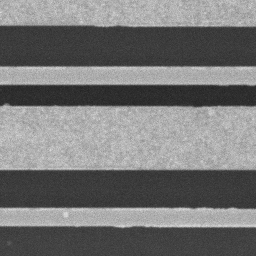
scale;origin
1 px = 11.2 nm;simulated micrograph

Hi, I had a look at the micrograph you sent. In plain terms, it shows lines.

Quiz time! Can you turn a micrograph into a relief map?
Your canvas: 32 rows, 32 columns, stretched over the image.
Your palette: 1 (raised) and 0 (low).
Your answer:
11111111111111111111111111111111
11111111111111111111111111111111
11111111111111111111111111111111
00000000000000000000000000000000
00000000000000000000000000000000
00000000000000000000000000000000
00000000000000000000000000000000
00000000000000000000000000000000
11111111111111111111111111111111
11111111111111111111111111111111
11111111111111111111111111111111
00000000000000000000000000000000
00000000000000000000000000000000
11111111111111111111111111111111
11111111111111111111111111111111
11111111111111111111111111111111
11111111111111111111111111111111
11111111111111111111111111111111
11111111111111111111111111111111
11111111111111111111111111111111
11111111111111111111111111111111
00000000000000000000000000000000
00000000000000000000000000000000
00000000000000000000000000000000
00000000000000000000000000000000
00000000000000000000000000000000
11111111111111111111111111111111
11111111111111111111111111111111
00000000000000000000000000000000
00000000000000000000000000000000
00000000000000000000000000000000
00000000000000000000000000000000